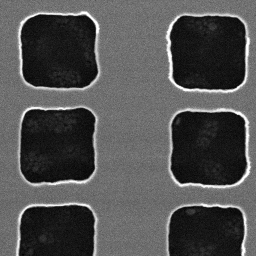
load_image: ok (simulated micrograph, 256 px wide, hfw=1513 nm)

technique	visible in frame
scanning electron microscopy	holes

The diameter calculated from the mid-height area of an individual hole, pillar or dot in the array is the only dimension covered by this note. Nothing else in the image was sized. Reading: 0.481 um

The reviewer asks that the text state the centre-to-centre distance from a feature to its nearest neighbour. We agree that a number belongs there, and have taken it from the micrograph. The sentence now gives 561 nanometers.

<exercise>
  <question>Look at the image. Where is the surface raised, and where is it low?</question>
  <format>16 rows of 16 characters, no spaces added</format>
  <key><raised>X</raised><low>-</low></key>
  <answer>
XXXXXXXXXXXXXXXX
XX----XXXXX----X
X-----XXXXX----X
X-----XXXXX----X
X-----XXXXX----X
XXXX-XXXXXXX---X
XXXXXXXXXXXXXXXX
X-----XXXXX----X
X-----XXXXX----X
X-----XXXXX----X
X-----XXXXX----X
XXXXXXXXXXXXX--X
XXXXXXXXXXXXXXXX
X-----XXXXX----X
X-----XXXXX----X
X-----XXXXX----X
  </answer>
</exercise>